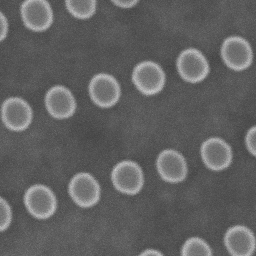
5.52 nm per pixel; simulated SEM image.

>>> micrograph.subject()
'a regular array of raised bodies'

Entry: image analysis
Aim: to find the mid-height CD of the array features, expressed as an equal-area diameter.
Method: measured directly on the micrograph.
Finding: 165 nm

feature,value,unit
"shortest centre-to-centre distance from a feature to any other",0.251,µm